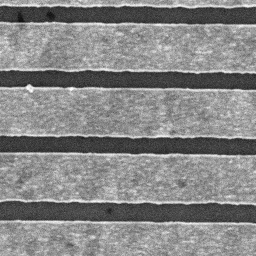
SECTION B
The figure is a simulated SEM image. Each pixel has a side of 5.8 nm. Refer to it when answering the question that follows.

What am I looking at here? lines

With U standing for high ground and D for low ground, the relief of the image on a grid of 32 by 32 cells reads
UUUUUUUUUUUUUUUUUUUUUUUUUUUUUUUU
DDDDDDDDDDDDDDDDDDDDDDDDDDDDDDDD
DDDDDDDDDDDDDDDDDDDDDDDDDDDDDDDD
UUUUUUUUUUUUUUUUUUUUUUUUUUUUUUUU
UUUUUUUUUUUUUUUUUUUUUUUUUUUUUUUU
UUUUUUUUUUUUUUUUUUUUUUUUUUUUUUUU
UUUUUUUUUUUUUUUUUUUUUUUUUUUUUUUU
UUUUUUUUUUUUUUUUUUUUUUUUUUUUUUUU
UUUUUUUUUUUUUUUUUUUUUUUUUUUUUUUU
DDDDDDDDDDDDDDDDDDDDDDDDDDDDDDDD
DDDDDDDDDDDDDDDDDDDDDDDDDDDDDDDD
UUUUUUUUUUUUUUUUUUUUUUUUUUUUUUUU
UUUUUUUUUUUUUUUUUUUUUUUUUUUUUUUU
UUUUUUUUUUUUUUUUUUUUUUUUUUUUUUUU
UUUUUUUUUUUUUUUUUUUUUUUUUUUUUUUU
UUUUUUUUUUUUUUUUUUUUUUUUUUUUUUUU
UUUUUUUUUUUUUUUUUUUUUUUUUUUUUUUU
DDDDDDDDDDDDDDDDDDDDDDDDDDDDDDDD
DDDDDDDDDDDDDDDDDDDDDDDDDDDDDDDD
UUUUUUUUUUUUUUUUUUUUUUUUUUUUDDDD
UUUUUUUUUUUUUUUUUUUUUUUUUUUUUUUU
UUUUUUUUUUUUUUUUUUUUUUUUUUUUUUUU
UUUUUUUUUUUUUUUUUUUUUUUUUUUUUUUU
UUUUUUUUUUUUUUUUUUUUUUUUUUUUUUUU
UUUUUUUUUUUUUUUUUUUUUUUUUUUUUUUU
DDDDDDDDDDDDDDDDDDDDDDDDDDDDDUDU
DDDDDDDDDDDDDDDDDDDDDDDDDDDDDDDD
DDDDDDDDDDDDDDDDDDDDDDDDDDDDDDDD
UUUUUUUUUUUUUUUUUUUUUUUUUUUUUUUU
UUUUUUUUUUUUUUUUUUUUUUUUUUUUUUUU
UUUUUUUUUUUUUUUUUUUUUUUUUUUUUUUU
UUUUUUUUUUUUUUUUUUUUUUUUUUUUUUUU